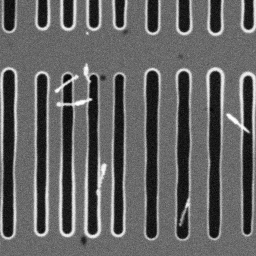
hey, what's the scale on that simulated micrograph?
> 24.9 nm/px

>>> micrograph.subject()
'groups of lines, slits or small figures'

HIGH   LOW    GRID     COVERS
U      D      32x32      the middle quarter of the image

UUUUUUUUUUUUUUUUUUUUUUUUUUUUUUUU
UUUUUUUUUUUUUUUUUUUUUDDUUUUUUDUU
DDUUUUUDUUUUUDUUUUUUDDDDUUUUUDDU
DDUUUUDDDUUUUDDUUUUUDDDDUUUUDDDD
DDUUUUDDDUUUDDDUUUUUDDDDUUUUDDDD
DDUUUUDDDUUUDDDUUUUUDDDDUUUUDDDD
DDUUUUDDDUUUDDDUUUUUDDDDUUUUDDDD
DDUUUUDDDUUUDDDUUUUUDDDDUUUUUDDU
DDUUUUDDDUUUDDDUUUUUDDDDUUUUUDDU
DDUUUUDDDUUUDDDUUUUUDDDDUUUUUDDU
DDUUUUDDDUUUDDDUUUUUDDDDUUUUUDDU
DDUUUUDDDUUUDDDUUUUUDDDDUUUUUDDU
DDUUUUDDDUUUDDDUUUUUDDDDUUUUDDDU
DDUUUUDDDUUUDDDUUUUUDDDDUUUUDDDU
DDUUUUDDDUUUDDDUUUUUDDDDUUUUDDDU
DDUUUUDDDUUUDDDUUUUUDDDDUUUUDDDU
DDUUUUDDDUUUDDDUUUUUDDDDUUUUDDDU
DDUUUUDDDUUUDDDUUUUUDDDDUUUUDDDD
DDUUUUDDDUUUDDDUUUUUDDDDUUUUDDDD
DDUUUUDDDUUUDDDUUUUUDDDDUUUUDDDD
DDUUUUDDDUUUDDDUUUUUDDDDUUUUDDDD
DDUUUUDDDUUUDDDUUUUUDDDDUUUUDDDU
DDUUUUDDDUUUDDDUUUUUDDDUUUUUDDDU
DDUUUUDDDUUUDDDUUUUUDDDUUUUUDDDU
DDUUUUDDDUUUDDDUUUUUDDDUUUUUDDDU
DDUUUUDDDUUUDDDUUUUUDDDUUUUUDDDU
DDUUUUDDDUUUDDDUUUUUDDDDUUUUDDDU
DDUUUUDDDUUUDDDUUUUUDDDDUUUUDDDU
DDUUUUDDDUUUDDDUUUUUDDDDUUUUDDDU
DDUUUUDDDUUUDDDUUUUUDDDDUUUUDDDU
DDUUUUDDDUUUDDDUUUUUDDDDUUUUDDDU
DDUUUUDDUUUUDDDUUUUUDDDUUUUUDDDU